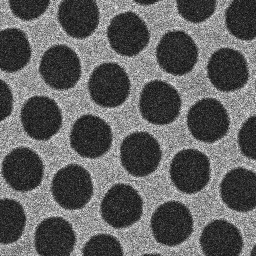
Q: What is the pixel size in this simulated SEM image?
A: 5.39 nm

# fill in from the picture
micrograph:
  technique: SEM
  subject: a regular array of holes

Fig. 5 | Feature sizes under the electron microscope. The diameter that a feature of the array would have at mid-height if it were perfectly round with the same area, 238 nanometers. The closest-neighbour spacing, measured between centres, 0.282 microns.